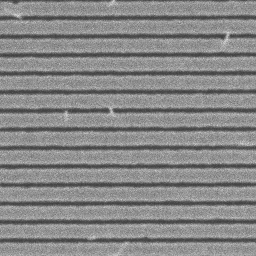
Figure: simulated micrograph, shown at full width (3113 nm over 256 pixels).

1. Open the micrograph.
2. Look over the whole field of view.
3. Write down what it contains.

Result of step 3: parallel lines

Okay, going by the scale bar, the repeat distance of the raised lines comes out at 226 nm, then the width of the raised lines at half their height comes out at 0.166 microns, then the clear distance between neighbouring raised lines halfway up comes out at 56.2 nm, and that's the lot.